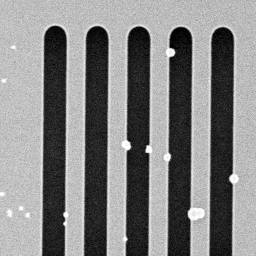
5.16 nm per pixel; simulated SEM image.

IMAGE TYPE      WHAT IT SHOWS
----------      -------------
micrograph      groups of lines, slits or small figures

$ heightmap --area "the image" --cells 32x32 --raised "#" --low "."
################################
################################
################################
######..###..####.####.####.####
######..###...##...##...##...###
#####...###...##...##...##...###
#####...###...##...###..##...###
#####...###...##...##...##...###
#####...###...##...##...##...###
#####...###...##...##...##...###
#####...###...##...##...##...###
#####...###...##...##...##...###
#####...###...##...##...##...###
#####...###...##...##...##...###
#####...###...##...##...##...###
#####...###...##...##...##...###
#####...###...##...##...##...###
#####...###...##...##...##...###
#####...###...##..###...##...###
#####...###...##...##...##...###
#####...###...##...##...##...###
#####...##....##...##...##...###
#####...##....##...##...##...###
#####...##....##...##...##...###
#####...##....##...##...##...###
#####...##....##...##...##...###
#####...##...###...##...##...###
#####...##...###...##...##...###
#####...##...###...##...##...###
#####...##...###...##...##...###
#####...##...###...##...##...###
#####...##...###...##...##...###